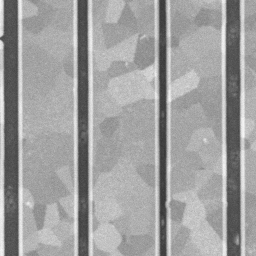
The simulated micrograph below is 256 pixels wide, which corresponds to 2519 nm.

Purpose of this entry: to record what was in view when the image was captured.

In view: one or a few lines or trenches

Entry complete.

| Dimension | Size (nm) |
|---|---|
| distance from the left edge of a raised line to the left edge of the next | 729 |